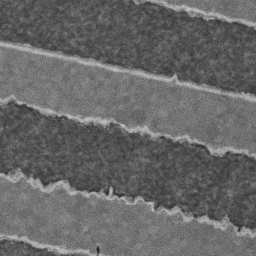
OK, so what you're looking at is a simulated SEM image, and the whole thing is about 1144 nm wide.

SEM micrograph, one or a few lines or trenches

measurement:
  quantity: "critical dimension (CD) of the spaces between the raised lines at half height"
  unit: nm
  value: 329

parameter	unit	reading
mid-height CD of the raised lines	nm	248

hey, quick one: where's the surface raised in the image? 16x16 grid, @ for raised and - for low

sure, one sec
------------@@@@
----------------
----------------
@@@@------------
@@@@@@@@--------
@@@@@@@@@@@@@---
-@@@@@@@@@@@@@@@
------@@@@@@@@@@
----------@@@@@@
---------------@
----------------
@@--------------
@@@@@@@@--------
@@@@@@@@@@@@----
@@@@@@@@@@@@@@@-
---@@@@@@@@@@@@@